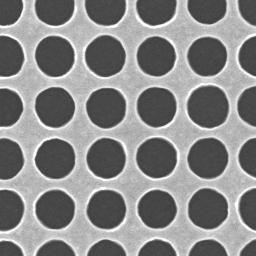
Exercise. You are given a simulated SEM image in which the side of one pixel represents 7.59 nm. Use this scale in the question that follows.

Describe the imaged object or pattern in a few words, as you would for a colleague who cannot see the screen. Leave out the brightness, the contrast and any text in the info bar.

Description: a regular array of holes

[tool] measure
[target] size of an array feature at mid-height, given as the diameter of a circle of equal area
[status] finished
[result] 0.308 µm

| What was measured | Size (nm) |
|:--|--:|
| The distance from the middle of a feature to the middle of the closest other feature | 383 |